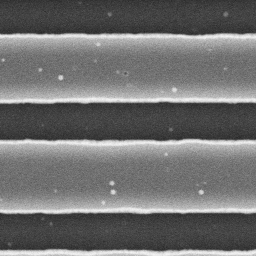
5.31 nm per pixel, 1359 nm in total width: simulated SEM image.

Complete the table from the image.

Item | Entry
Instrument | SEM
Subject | lines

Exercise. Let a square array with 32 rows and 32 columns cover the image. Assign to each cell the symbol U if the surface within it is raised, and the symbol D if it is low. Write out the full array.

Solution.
DDDDDDDDDDDDDDDDDDDDDDDDDDDDDDDD
DDDDDDDDDDDDDDDDDDDDDDDDDDDDDDDD
DDDDDDDDDDDDDDDDDDDDDDDDDDDDDDDD
DDDDDDDDDDDDDDDDDDDDDDDDDDDDDDDD
UUUUUUUUUUUUUUUUUUUUUUUUUUUUUUUU
UUUUUUUUUUUUUUUUUUUUUUUUUUUUUUUU
UUUUUUUUUUUUUUUUUUUUUUUUUUUUUUUU
UUUUUUUUUUUUUUUUUUUUUUUUUUUUUUUU
UUUUUUUUUUUUUUUUUUUUUUUUUUUUUUUU
UUUUUUUUUUUUUUUUUUUUUUUUUUUUUUUU
UUUUUUUUUUUUUUUUUUUUUUUUUUUUUUUU
UUUUUUUUUUUUUUUUUUUUUUUUUUUUUUUU
UUUUUUUUUUUUUUUUUUUUUUUUUUUUUUUU
DDDDDDDDDDDDDDDDDDDDDDDDDDDDDDDD
DDDDDDDDDDDDDDDDDDDDDDDDDDDDDDDD
DDDDDDDDDDDDDDDDDDDDDDDDDDDDDDDD
DDDDDDDDDDDDDDDDDDDDDDDDDDDDDDDD
DDDDDDDDDDDDDDDDDDDDDDDDDDDDDDDD
UUUUUUUUUUUUUUUUUUUUUUUUUUUUUUUU
UUUUUUUUUUUUUUUUUUUUUUUUUUUUUUUU
UUUUUUUUUUUUUUUUUUUUUUUUUUUUUUUU
UUUUUUUUUUUUUUUUUUUUUUUUUUUUUUUU
UUUUUUUUUUUUUUUUUUUUUUUUUUUUUUUU
UUUUUUUUUUUUUUUUUUUUUUUUUUUUUUUU
UUUUUUUUUUUUUUUUUUUUUUUUUUUUUUUU
UUUUUUUUUUUUUUUUUUUUUUUUUUUUUUUU
UUUUUUUUUDDDDDDDDUUDDDUUDDDDDDUD
DDDDDDDDDDDDDDDDDDDDDDDDDDDDDDDD
DDDDDDDDDDDDDDDDDDDDDDDDDDDDDDDD
DDDDDDDDDDDDDDDDDDDDDDDDDDDDDDDD
DDDDDDDDDDDDDDDDDDDDDDDDDDDDDDDD
UUUUUUUUUUDUUUUUUUUDDDUUUUUUDUUU